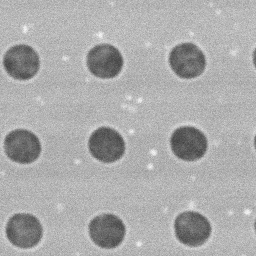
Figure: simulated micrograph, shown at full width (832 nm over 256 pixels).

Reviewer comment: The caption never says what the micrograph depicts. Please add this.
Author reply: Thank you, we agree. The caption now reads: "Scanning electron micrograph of a regular array of holes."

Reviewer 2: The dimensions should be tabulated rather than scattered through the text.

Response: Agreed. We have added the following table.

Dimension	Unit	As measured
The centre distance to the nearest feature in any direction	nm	270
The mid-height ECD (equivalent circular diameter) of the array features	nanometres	122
